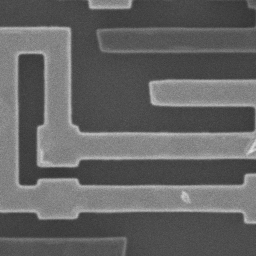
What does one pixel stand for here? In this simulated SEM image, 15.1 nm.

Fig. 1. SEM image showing wiring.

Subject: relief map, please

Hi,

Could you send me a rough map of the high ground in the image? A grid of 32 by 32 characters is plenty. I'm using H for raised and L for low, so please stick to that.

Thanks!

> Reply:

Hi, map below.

LLLLLLLLLLLHHHHHLLLLLLLLLLLLLLLH
LLLLLLLLLLLLLLLLLLLLLLLLLLLLLLLL
LLLLLLLLLLLLLLLLLLLLLLLLLLLLLLLL
LLLLLHHHLLLLLLLLLLLLLLLLLLLLLLLH
HHHHHHHHHLLLHHHHHHHHHHHHHHHHHHHH
HHHHHHHHHLLLHHHHHHHHHHHHHHHHHHHH
HHHHHHHHHLLLLLHHLLLLHHHLLLLLLLLL
HHLLLLHHHLLLLLLLLLLLLLLLLLLLLLLL
HHLLLLHHHLLLLLLLLLLLLLLLLLLLLLLL
HHLLLLHHHLLLLLLLLLLLLLLLLLLLLLLL
HHLLLLHHHLLLLLLLLLLHHHHHHHHHHHHH
HHLLLLHHHLLLLLLLLLLHHHHHHHHHHHHH
HHLLLLHHHLLLLLLLLLLHHHHHHHHHHHHH
HHLLLLHHHLLLLLLLLLLLLLLLLLLLLLLL
HHLLLLHHHLLLLLLLLLLLLLLLLLLLLLLL
HHLLLHHHHLLLLLLLLLLLLLLLLLLLLLLL
HHLLLHHHHHLLLLLLLLLLLLLLLLLLLLLH
HHLLLHHHHHHHHHHHHHHHHHHHHHHHHHHH
HHLLLHHHHHHHHHHHHHHHHHHHHHHHHHHH
HHLLLHHHHHHHHHHHHHHHHHHHHHHHHHHH
HHLLLHHHHHLLLLLLLLLLLLLLLLLLLLLL
HHLLLLLLLLLLLLLLLLLLLLLLLLLLLLLL
HHLLLHHHHLLLLLLLLLLLLLLLLLLLLLHH
HHHHHHHHHHHHHHHHHHHHHHHHHHHHHHHH
HHHHHHHHHHHHHHHHHHHHHHHHHHHHHHHH
HHHHHHHHHHHHHHHHHHHHHHHHHHHHHHHH
HHHHHHHHHHLLHHLLLLLLLLLLLLLLLLHH
LLLLLLLLLLLLLLLLLLLLLLLLLLLLLLLH
LLLLLLLLLLLLLLLLLLLLLLLLLLLLLLLL
LLLLLLLLLLLLLLLLLLLLLLLLLLLLLLLL
HHHHHHHHHHHHHHHHLLLLLLLLLLLLLLLL
HHHHHHHHHHHHHHHHLLLLLLLLLLLLLLLL